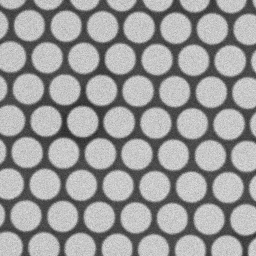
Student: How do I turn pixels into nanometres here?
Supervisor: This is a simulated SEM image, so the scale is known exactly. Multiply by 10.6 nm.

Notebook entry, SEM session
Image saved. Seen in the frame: an array of small figures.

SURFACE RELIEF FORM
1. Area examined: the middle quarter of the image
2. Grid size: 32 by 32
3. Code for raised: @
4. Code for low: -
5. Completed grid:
--@@@@@@---@@@@@@---@@@@@@@--@@@
---@@@@----@@@@@@---@@@@@@----@@
----------------------@@-------@
@@@----@@@@@-----@@@------@@@---
@@@---@@@@@@@---@@@@@@---@@@@@@-
@@@@--@@@@@@@--@@@@@@@--@@@@@@@-
@@@@--@@@@@@@--@@@@@@@--@@@@@@@-
@@@@--@@@@@@@--@@@@@@@--@@@@@@@-
@@@---@@@@@@@--@@@@@@@--@@@@@@@-
@@-----@@@@@----@@@@@----@@@@@--
---------------------------@@---
--@@@@@-----@@@@-----@@@@-----@@
-@@@@@@@---@@@@@@---@@@@@@---@@@
-@@@@@@@--@@@@@@@--@@@@@@@@--@@@
-@@@@@@@--@@@@@@@--@@@@@@@@-@@@@
-@@@@@@@--@@@@@@@--@@@@@@@@-@@@@
-@@@@@@@---@@@@@@---@@@@@@---@@@
--@@@@@----@@@@@----@@@@@@---@@@
----------------------@--------@
@@-----@@@@@----@@@@-----@@@@---
@@@---@@@@@@---@@@@@@---@@@@@@--
@@@@-@@@@@@@@-@@@@@@@@--@@@@@@@-
@@@@-@@@@@@@@-@@@@@@@@--@@@@@@@-
@@@---@@@@@@@--@@@@@@@--@@@@@@@-
@@@---@@@@@@---@@@@@@@--@@@@@@@-
@@-----@@@@-----@@@@@----@@@@@--
---------------------------@----
--@@@@@----@@@@@-----@@@@-----@@
-@@@@@@@--@@@@@@@---@@@@@@---@@@
-@@@@@@@--@@@@@@@--@@@@@@@--@@@@
-@@@@@@@--@@@@@@@--@@@@@@@--@@@@
-@@@@@@@--@@@@@@@--@@@@@@@--@@@@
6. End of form